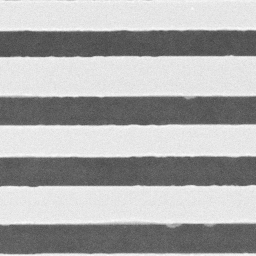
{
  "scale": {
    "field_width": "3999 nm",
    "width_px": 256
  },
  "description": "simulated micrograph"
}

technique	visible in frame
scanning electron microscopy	lines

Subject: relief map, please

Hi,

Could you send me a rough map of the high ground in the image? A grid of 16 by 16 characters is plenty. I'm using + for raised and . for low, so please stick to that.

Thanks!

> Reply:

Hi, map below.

++++++++++++++++
++++++++++++++++
................
..............+.
++++++++++++++++
++++++++++++++++
................
................
++++++++++++++++
++++++++++++++++
................
................
++++++++++++++++
++++++++++++++++
................
................